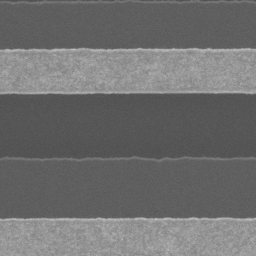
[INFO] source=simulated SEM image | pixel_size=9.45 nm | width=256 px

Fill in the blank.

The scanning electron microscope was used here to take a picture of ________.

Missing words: lines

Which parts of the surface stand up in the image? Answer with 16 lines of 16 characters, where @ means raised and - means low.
@@@@@@@@@@@@@@@@
@@@@@@@@@@@@@@@@
@@@@@@@@@@@@@@@@
@@@@@@@@@@@@@@@@
@@@@@@@@@@@@@@@@
@@@@@@@@@@@@@@@@
----------------
----------------
----------------
----------------
@@@@@@@@@@@@@@@@
@@@@@@@@@@@@@@@@
@@@@@@@@@@@@@@@@
@@@@@@@@@@@@@@@@
@@@@@@@@@@@@@@@@
@@@@@@@@@@@@@@@@